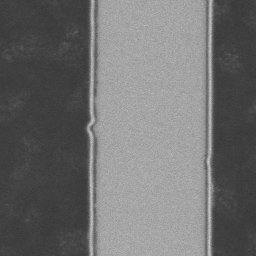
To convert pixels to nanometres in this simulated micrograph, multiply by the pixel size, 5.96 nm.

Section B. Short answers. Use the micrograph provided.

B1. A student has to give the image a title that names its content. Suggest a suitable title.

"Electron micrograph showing one or a few lines or trenches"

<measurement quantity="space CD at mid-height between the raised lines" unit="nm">693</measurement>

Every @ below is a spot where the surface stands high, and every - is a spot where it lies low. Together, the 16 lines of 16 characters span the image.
@@@@@@-------@@@
@@@@@@-------@@@
@@@@@@-------@@@
@@@@@@-------@@@
@@@@@@-------@@@
@@@@@@-------@@@
@@@@@@-------@@@
@@@@@@-------@@@
@@@@@@-------@@@
@@@@@@-------@@@
@@@@@@-------@@@
@@@@@@-------@@@
@@@@@@-------@@@
@@@@@@-------@@@
@@@@@@-------@@@
@@@@@@-------@@@